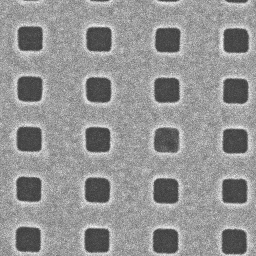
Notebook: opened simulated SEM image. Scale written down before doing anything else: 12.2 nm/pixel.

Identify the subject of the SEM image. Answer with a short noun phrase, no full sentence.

a regular array of holes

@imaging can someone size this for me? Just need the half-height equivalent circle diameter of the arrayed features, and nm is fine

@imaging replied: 343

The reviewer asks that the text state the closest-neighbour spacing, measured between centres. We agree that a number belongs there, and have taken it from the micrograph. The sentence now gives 0.611 µm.